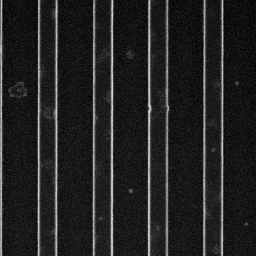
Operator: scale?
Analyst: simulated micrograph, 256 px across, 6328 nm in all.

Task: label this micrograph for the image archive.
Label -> parallel lines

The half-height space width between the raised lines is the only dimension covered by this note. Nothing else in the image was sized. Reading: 905 nm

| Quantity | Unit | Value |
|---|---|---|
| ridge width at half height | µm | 0.454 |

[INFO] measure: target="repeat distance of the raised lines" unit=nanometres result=1360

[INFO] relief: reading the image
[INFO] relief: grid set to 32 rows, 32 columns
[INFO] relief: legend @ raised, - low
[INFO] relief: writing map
-----@@-----@@-----@@-----@@----
-----@@-----@@-----@@-----@@----
-----@@-----@@-----@@-----@@----
-----@@-----@@-----@@-----@@----
-----@@-----@@-----@@-----@@----
-----@@-----@@-----@@-----@@----
-----@@-----@@-----@@-----@@----
-----@@-----@@-----@@-----@@----
-----@@-----@@-----@@-----@@----
-----@@-----@@-----@@-----@@----
-----@@-----@@-----@@-----@@----
-----@@-----@@-----@@-----@@----
-----@@-----@@-----@@-----@@----
-----@@-----@@-----@@-----@@----
-----@@-----@@-----@@-----@@----
-----@@-----@@-----@@-----@@----
-----@@-----@@-----@@-----@@----
-----@@-----@@-----@@-----@@----
-----@@-----@@-----@@-----@@----
-----@@-----@@-----@@-----@@----
-----@@-----@@-----@@-----@@----
-----@@-----@@-----@@-----@@----
-----@@-----@@-----@@----@@@----
-----@@-----@@-----@@-----@@----
-----@@-----@@-----@@-----@@----
-----@@-----@@-----@@-----@@----
-----@@-----@@-----@@-----@@----
-----@@-----@@-----@@-----@@----
-----@@-----@@-----@@-----@@----
-----@@-----@@-----@@-----@@----
-----@@-----@@-----@@-----@@----
-----@@-----@@-----@@-----@@----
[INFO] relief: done